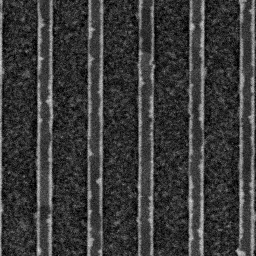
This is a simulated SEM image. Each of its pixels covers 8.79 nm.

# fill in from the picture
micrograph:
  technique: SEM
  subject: parallel lines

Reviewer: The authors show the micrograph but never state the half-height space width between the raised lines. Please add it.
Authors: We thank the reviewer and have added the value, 0.32 µm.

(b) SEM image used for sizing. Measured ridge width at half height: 0.124 micrometres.